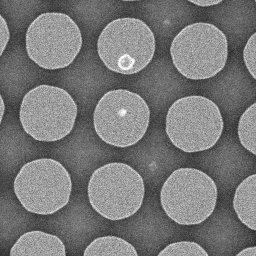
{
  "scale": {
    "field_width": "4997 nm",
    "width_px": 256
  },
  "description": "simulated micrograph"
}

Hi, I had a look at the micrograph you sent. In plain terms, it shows an array of small figures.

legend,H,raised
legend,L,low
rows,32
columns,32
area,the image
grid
LLLLLLLLLLLLLLLLLLLLLLLLLHHLLLLL
LLLLLLLLLLLLLLLLLLLLLLLLLLLLLLLL
LLLLHHHHHLLLLLLHHLLLLLLLLLLLLLLL
HLLLHHHHHHLLLHHHHHHLLLLHHHHLLLLL
HLLHHHHHHHLLLHHHHHHLLLHHHHHHLLLL
HLLHHHHHHHLLHHHHHHHLLLHHHHHHLLLH
LLLHHHHHHHLLHHHHHHHLLHHHHHHHLLLH
LLLLHHHHHLLLLHHHHHHLLLHHHHHHLLLH
LLLLLLHLLLLLLLHHHHLLLLHHHHHHLLLH
LLLLLLLLLLLLLLLLLLLLLLLHHHLLLLLL
LLLLLLLLLLLLLLLLLLLLLLLLLLLLLLLL
LLLLHHHHLLLLLLHHLLLLLLLLLLLLLLLL
LLLHHHHHHLLLLHHHHHLLLLHHHHLLLLLL
LLLHHHHHHHLLHHHHHHLLLHHHHHHLLLLH
LLLHHHHHHLLLHHHHHHHLLHHHHHHHLLHH
LLLHHHHHHLLLHHHHHHHLLHHHHHHHLLHH
LLLHHHHHHLLLHHHHHHLLLHHHHHHHLLHH
LLLLLHHLLLLLLHHHHLLLLHHHHHHLLLHH
LLLLLLLLLLLLLLLLLLLLLLHHHHLLLLLH
LLLLLLLLLLLLLLLLLLLLLLLLLLLLLLLL
LLLHHHHLLLLLLLHLLLLLLLLLLLLLLLLL
LLHHHHHHLLLLHHHHHLLLLLHHHLLLLLLL
LLHHHHHHHLLHHHHHHHLLLHHHHHLLLLLH
LLHHHHHHHLLHHHHHHHLLHHHHHHHLLLHH
LLHHHHHHHLLHHHHHHHLLHHHHHHHLLHHH
LLLHHHHHLLLHHHHHHHLLHHHHHHHLLHHH
LLLLHHHLLLLLHHHHHLLLLHHHHHLLLLHH
LLLLLLLLLLLLLLLLLLLLLLHHHLLLLLHH
LLLLLLLLLLLLLLLLLLLLLLLLLLLLLLLH
LLLHHHHLLLLLLLLLLLLLLLLLLLLLLLLL
LLHHHHHHLLLHHHHHLLLLLLHHHLLLLLLL
LHHHHHHHLLLHHHHHHLLLHHHHHHLLLLHH